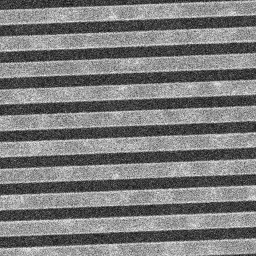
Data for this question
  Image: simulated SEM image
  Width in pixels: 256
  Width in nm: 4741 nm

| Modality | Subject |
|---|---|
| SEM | parallel lines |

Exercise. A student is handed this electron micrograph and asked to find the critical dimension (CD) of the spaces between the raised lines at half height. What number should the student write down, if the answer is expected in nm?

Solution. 222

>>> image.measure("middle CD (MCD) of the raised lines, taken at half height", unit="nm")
268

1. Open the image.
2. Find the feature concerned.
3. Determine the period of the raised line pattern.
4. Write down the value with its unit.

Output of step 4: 490 nm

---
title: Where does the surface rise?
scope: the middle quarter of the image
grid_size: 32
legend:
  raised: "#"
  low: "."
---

################################
##############################..
####............................
................................
................................
..........######################
################################
################################
#####################...........
................................
................................
...........................#####
.###############################
################################
################################
############....................
................................
................................
.................###############
################################
################################
############################....
##..............................
................................
................................
........########################
################################
################################
###################.............
................................
................................
.........................#######